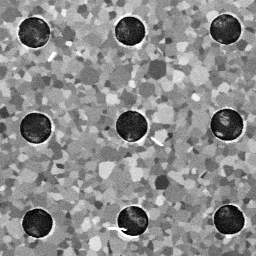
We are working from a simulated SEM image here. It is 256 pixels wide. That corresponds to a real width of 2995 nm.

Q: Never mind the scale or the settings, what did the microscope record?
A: a regular array of holes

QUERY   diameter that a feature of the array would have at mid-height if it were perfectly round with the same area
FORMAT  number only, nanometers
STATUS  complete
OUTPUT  369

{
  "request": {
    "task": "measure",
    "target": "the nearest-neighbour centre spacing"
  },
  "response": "1120 nm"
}